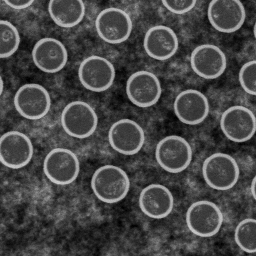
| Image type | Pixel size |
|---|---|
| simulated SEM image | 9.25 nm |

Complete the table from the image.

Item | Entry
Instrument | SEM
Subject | a regular array of raised bodies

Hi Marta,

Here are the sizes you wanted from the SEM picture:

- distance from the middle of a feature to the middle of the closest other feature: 456 nm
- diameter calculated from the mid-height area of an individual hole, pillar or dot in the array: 0.312 µm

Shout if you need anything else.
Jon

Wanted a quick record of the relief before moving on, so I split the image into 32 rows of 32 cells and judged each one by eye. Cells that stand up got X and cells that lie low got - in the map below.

-XXX--XXXX-----------XXX--XXXX--
------XXXX---XX-------X---XXXX--
-------XXX--XXXX----------XXXX--
XX----------XXXX---XX------XX---
XX-----------XXX--XXXX----------
XX---XXX----------XXXX----------
XX--XXXX-----------XXX--XXXX----
----XXXX---XX-----------XXXX----
-----XXX--XXXX----------XXXX--XX
----------XXXX---XX------XX---XX
-----------XXX--XXXX----------XX
--XXXX----------XXXX---XX------X
--XXXX-----------XX---XXXX------
--XXXX--XXX-----------XXXX---X--
---XX---XXXX----------XXXX--XXXX
--------XXXX--XXX-----------XXXX
---------XX---XXXX----------XXXX
XXXX----------XXXX---XX------XX-
XXXX----------XXX---XXXX--------
XXXX--XXX-----------XXXX---X----
-XX---XXXX----------XXX---XXX---
------XXXX--XXX-----------XXXX--
-------XX---XXXX----------XXX---
------------XXXX--XX-------X----
------------XXX---XXX-----------
------------------XXX----X------
------------------XXX---XXX-----
-----------------------XXXXX----
------------------------XXX---XX
------------------------------XX
------------------------------XX
--------------------------------